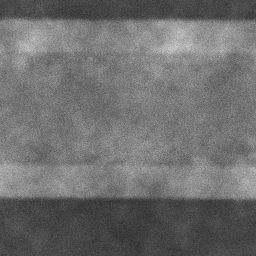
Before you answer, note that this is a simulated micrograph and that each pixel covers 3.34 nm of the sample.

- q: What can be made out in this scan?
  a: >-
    one or a few lines or trenches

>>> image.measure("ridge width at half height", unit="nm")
469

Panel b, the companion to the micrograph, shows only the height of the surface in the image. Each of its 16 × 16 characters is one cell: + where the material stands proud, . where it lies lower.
................
................
++++++++++++++++
++++++++++++++++
++++++++++++++++
++++++++++++++++
++++++++++++++++
++++++++++++++++
++++++++++++++++
++++++++++++++++
++++++++++++++++
................
................
................
................
................